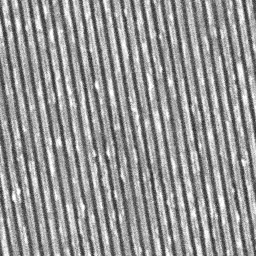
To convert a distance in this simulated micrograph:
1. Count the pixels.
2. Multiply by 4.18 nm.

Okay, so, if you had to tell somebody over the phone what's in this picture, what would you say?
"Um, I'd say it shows parallel lines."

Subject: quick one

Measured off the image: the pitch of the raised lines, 10 pixels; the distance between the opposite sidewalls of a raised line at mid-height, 22.1 nanometers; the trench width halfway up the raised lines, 22.1 nm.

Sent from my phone